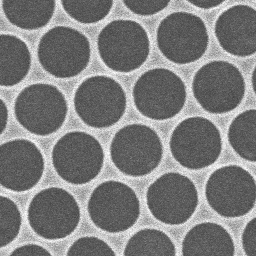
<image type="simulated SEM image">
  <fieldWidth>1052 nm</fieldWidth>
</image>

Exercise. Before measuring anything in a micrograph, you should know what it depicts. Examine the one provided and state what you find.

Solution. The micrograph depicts a regular array of holes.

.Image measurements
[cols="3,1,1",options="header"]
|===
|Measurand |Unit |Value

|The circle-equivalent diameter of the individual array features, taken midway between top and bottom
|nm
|215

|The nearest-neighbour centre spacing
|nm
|245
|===